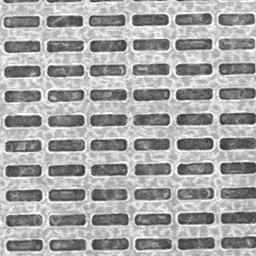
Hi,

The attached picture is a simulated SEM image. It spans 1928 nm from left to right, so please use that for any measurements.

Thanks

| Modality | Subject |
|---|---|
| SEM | a regular array of holes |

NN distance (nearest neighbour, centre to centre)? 24.7 px